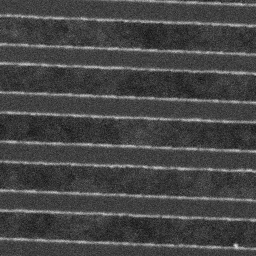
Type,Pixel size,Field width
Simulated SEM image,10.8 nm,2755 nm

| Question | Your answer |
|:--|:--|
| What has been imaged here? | lines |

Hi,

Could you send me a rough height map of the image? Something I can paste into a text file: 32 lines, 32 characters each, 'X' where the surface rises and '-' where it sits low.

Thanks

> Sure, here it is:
XXXXXXXXXXXXXXXXXXXXXXXXXXXXXX--
XXXXXXXXXXXXXXXXXXXXXXXXXXXXXXXX
------------XXXXXXXXXXXXXXXXXXXX
--------------------------------
--------------------------------
X-------------------------------
XXXXXXXXXXXXXXXXXXXXXXXXX-------
XXXXXXXXXXXXXXXXXXXXXXXXXXXXXXXX
------------XX-XXXXXXXXXXXXXXXXX
--------------------------------
--------------------------------
--------------------------------
XXXXXXXXXXXXXXXXXXXXXXXXX-------
XXXXXXXXXXXXXXXXXXXXXXXXXXXXXXXX
---------XXXXXXXXXXXXXXXXXXXXXXX
--------------------------------
--------------------------------
--------------------------------
XXXXXXXXXXXXXXXXXXXXX-----------
XXXXXXXXXXXXXXXXXXXXXXXXXXXXXXXX
-----XXXXXXXXXXXXXXXXXXXXXXXXXXX
--------------------------------
--------------------------------
--------------------------------
XXXXXXXXXXXXXXXXXX--------------
XXXXXXXXXXXXXXXXXXXXXXXXXXXXXXXX
-------XXXXXXXXXXXXXXXXXXXXXXXXX
-------------------------------X
--------------------------------
--------------------------------
XXXXXXXXXXXXXXXX----------------
XXXXXXXXXXXXXXXXXXXXXXXXXXXXXXXX